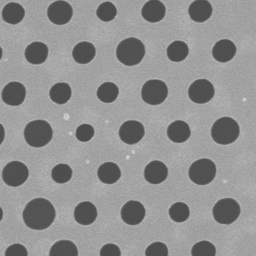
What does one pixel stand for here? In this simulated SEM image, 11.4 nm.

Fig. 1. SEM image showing a regular array of holes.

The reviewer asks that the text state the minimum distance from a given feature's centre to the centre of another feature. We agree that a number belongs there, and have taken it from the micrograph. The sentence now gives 528 nm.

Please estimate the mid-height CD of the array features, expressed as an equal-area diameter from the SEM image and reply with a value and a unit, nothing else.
262 nm